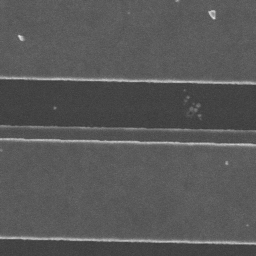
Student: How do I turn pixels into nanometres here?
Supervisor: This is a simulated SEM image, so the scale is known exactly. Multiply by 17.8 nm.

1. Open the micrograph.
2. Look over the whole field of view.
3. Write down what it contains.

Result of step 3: lines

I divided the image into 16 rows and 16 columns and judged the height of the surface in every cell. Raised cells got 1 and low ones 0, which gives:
1111111111111111
1111111111111111
1111111111111111
1111111111111111
1111111111111111
0000000000000000
0000000000000000
0000000000000000
1111111111111111
1111111111111111
1111111111111111
1111111111111111
1111111111111111
1111111111111111
1111111111111111
0000000000000000